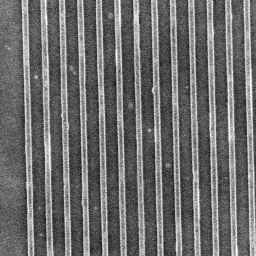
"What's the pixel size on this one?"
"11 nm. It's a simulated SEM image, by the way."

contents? parallel lines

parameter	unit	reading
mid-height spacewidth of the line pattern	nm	147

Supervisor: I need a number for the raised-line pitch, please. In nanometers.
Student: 202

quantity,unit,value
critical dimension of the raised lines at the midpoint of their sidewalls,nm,54.8